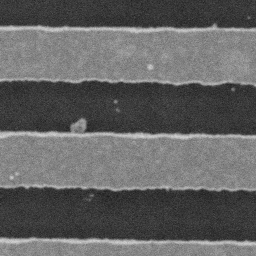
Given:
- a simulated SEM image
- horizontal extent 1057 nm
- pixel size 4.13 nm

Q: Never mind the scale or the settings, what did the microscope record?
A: lines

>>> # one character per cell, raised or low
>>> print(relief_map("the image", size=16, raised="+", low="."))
................
................
++++++++++++++++
++++++++++++++++
++++++++++++++++
................
................
................
++++++++++++++++
++++++++++++++++
++++++++++++++++
++++++++++++++++
................
................
................
++++++++++++++++